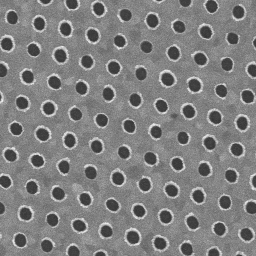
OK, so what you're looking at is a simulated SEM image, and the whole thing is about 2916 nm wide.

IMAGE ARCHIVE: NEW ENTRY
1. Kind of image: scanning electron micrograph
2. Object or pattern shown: a regular array of holes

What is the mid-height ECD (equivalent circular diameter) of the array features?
145 nanometers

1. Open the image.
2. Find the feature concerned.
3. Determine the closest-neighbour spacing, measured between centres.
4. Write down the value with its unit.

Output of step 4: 306 nanometres